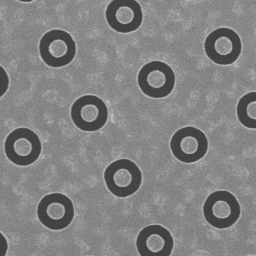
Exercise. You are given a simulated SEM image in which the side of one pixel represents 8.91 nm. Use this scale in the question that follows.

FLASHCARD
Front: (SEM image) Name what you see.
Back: a regular array of ring-shaped grooves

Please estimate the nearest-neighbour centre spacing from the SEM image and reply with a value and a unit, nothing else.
647 nm